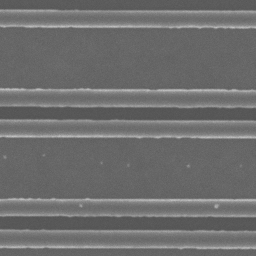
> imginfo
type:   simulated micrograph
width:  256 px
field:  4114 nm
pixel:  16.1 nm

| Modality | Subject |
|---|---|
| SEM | lines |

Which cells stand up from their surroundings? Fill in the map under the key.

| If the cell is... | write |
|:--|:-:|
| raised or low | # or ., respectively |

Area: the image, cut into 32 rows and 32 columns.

................................
################################
################################
................................
................................
................................
................................
................................
................................
................................
................................
################################
################################
................................
................................
################################
################################
................................
................................
................................
................................
................................
................................
................................
................................
################################
################################
................................
................................
################################
################################
................................